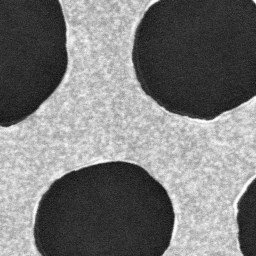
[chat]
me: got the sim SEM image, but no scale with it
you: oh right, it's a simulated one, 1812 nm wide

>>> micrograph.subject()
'holes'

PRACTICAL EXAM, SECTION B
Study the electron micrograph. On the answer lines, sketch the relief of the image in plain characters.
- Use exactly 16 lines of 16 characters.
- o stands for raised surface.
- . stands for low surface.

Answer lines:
....ooooo.......
....ooooo.......
....oooo........
....oooo........
....oooo........
....ooooo.......
...ooooooo.....o
.ooooooooooo.ooo
oooooooooooooooo
oooooooooooooooo
ooooo....ooooooo
ooo.......ooooo.
oo.........oooo.
oo.........oooo.
oo.........oooo.
oo........ooooo.